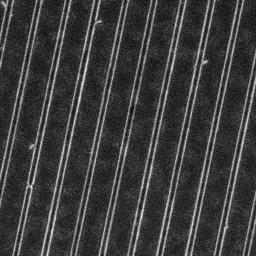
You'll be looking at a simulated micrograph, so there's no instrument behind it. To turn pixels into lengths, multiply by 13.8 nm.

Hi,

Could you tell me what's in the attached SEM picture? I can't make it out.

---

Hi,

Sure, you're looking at parallel lines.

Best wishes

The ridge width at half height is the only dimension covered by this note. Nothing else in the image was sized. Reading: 81 nm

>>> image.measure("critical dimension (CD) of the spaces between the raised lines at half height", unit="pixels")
22.5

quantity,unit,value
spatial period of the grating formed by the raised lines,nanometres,388